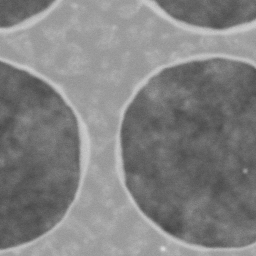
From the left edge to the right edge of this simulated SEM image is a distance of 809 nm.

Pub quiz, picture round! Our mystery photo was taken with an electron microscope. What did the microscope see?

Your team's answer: holes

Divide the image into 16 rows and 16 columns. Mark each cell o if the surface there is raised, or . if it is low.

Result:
...ooooooo......
..ooooooooo....o
oooooooooooooooo
oooooooooooooooo
..oooooooo......
...oooooo.......
....oooo........
.....ooo........
.....ooo........
.....ooo........
.....ooo........
.....ooo........
.....ooo........
....ooooo.......
...ooooooo......
.oooooooooooo..o